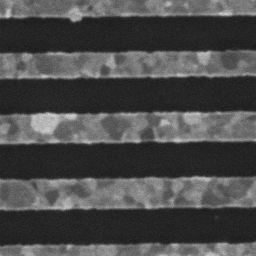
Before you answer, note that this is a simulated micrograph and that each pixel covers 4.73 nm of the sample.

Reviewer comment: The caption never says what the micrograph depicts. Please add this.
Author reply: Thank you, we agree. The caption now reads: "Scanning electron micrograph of lines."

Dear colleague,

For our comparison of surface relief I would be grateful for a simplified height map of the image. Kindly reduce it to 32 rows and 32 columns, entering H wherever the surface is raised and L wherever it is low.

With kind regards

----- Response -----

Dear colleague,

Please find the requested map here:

HHHHHHHHHHHHHHHHHHHHHHHHHHHHHHHH
HHHHHHHHHHHHHHHHHHHHHHHHHHHHHHHH
LLLLLLLLLHLLLLLLLLLLLLLLLLLLLLLL
LLLLLLLLLLLLLLLLLLLLLLLLLLLLLLLL
LLLLLLLLLLLLLLLLLLLLLLLLLLLLLLLL
LLLLLLLLLLLLLLLLLLLLLLLLLLLLLLLL
LLLLLLLLLLLLLLLLLLLLLLLLLLHLHHHH
HHHHHHHHHHHHHHHHHHHHHHHHHHHHHHHH
HHHHHHHHHHHHHHHHHHHHHHHHHHHHHHHH
HHHHHHHHHHHHHHHHHHHHHHHHLLHHHHLL
LLLLLLLLLLLLLLLLLLLLLLLLLLLLLLLL
LLLLLLLLLLLLLLLLLLLLLLLLLLLLLLLL
LLLLLLLLLLLLLLLLLLLLLLLLLLLLLLLL
LLLLLLLLLLLLLLLLLLLLLLLLLLLLLLLL
HHHHHHHHHHHHHHHHHHHHHHHHHHHHHHHH
HHHHHHHHHHHHHHHHHHHHHHHHHHHHHHHH
HHHHHHHHHHHHHHHHHHHHHHHHHHHHHHHH
HHHHHHHHHHHHHHHHHHHHHHHHHHHHHHHH
LLLLLLLLLLLLLLLLLLLLLLLLLLLLLLLL
LLLLLLLLLLLLLLLLLLLLLLLLLLLLLLLL
LLLLLLLLLLLLLLLLLLLLLLLLLLLLLLLL
LLLLLLLLLLLLLLLLLLLLLLLLLLLLLLLL
HHLLHHHHHHHHHHHHHHHHHHHHHHHHHHHH
HHHHHHHHHHHHHHHHHHHHHHHHHHHHHHHH
HHHHHHHHHHHHHHHHHHHHHHHHHHHHHHHH
HHHHHHHHHHHHHHHHHHHHHHHHHHHHHHHH
LLLLLLLLLLLLLLLLLLLLLLLLLLLLLLLL
LLLLLLLLLLLLLLLLLLLLLLLLLLLLLLLL
LLLLLLLLLLLLLLLLLLLLLLLLLLLLLLLL
LLLLLLLLLLLLLLLLLLLLLLLLLLLLLLLL
LLLLLLLLLLLLLLLLLLHHLLLLLLHHHLHH
HHHHHHHHHHHHHHHHHHHHHHHHHHHHHHHH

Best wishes